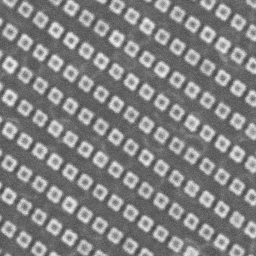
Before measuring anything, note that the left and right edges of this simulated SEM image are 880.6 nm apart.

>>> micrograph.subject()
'a regular array of raised bodies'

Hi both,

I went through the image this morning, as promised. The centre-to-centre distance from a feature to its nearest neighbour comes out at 62.8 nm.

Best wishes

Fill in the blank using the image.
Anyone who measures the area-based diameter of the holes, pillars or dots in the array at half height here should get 43.7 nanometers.